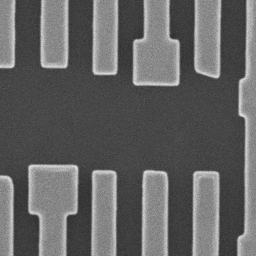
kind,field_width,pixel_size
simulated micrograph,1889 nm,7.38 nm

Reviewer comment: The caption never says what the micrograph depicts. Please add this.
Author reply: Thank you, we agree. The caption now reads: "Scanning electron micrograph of wiring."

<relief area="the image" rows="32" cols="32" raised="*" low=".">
**...***....***...***...****...*
**...***....***...***...****...*
**...***....***...***...****...*
**...***....***...***...***....*
**...***....***...***...***....*
**...***....***..*****..***....*
**...***....***..*****..***....*
**...***....***..*****..***....*
............***..*****..***....*
.................*****....*....*
.................*****........**
..............................**
..............................**
..............................**
..............................**
...............................*
...............................*
...............................*
...............................*
...............................*
...............................*
....******..**....**.....**....*
*...******..***...***...***....*
**..******..***...***...***....*
**..******..***...***...***....*
**..******..***...***...***....*
**..*****...***...***...***....*
**...***....**....***...***....*
**...***....**....***...***....*
**...***....**....***...***...**
**...***....**....***...***...**
**...***....**....***...***...**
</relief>